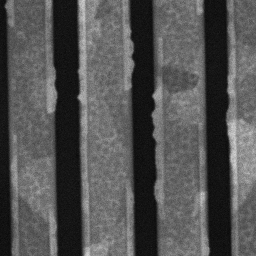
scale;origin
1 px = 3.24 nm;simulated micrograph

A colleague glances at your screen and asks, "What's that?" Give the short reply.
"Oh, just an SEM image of one or a few lines or trenches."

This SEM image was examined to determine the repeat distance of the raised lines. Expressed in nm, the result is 240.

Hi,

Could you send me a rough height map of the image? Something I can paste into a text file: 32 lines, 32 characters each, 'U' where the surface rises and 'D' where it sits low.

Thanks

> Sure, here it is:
DUUUUUDDDDUUUUUUDDDUUUUUUDDDUUUU
DUUUUUDDDDUUUUUUDDDUUUUUUDDDDUUU
DUUUUUDDDDUUUUUUDDDUUUUUUDDDDUUU
DUUUUUDDDDUUUUUUDDDDUUUUUDDDDUUU
DUUUUUDDDDUUUUUUDDDDUUUUUDDDDUUU
DUUUUUDDDDUUUUUUUDDDUUUUUDDDDUUU
DUUUUUDDDDUUUUUUUDDDUUUUUDDDDUUU
DUUUUUUDDDUUUUUUUDDDUUUUUDDDDUUU
DUUUUUUDDDUUUUUUUDDDUUUUUDDDDUUU
DUUUUUUDDDUUUUUUDDDDUUUUUDDDDUUU
DUUUUUUDDDUUUUUUDDDDUUUUUDDDDUUU
DUUUUUUDDDUUUUUUDDDUUUUUUDDDDUUU
DUUUUUUDDDUUUUUUDDDUUUUUUDDDDUUU
DUUUUUUDDDUUUUUUDDDUUUUUUDDDDUUU
DUUUUUUDDDUUUUUUDDDUUUUUUDDDUUUU
DUUUUUUDDDUUUUUUDDDUUUUUUDDDUUUU
DUUUUUUDDDUUUUUUDDDUUUUUUUDDDUUU
DUUUUUUDDDUUUUUUDDDUUUUUUUDDDUUU
DUUUUUUDDDUUUUUUDDDUUUUUUUDDDUUU
DUUUUUUDDDUUUUUUDDDUUUUUUUDDDUUU
DUUUUUUDDDUUUUUUDDDDUUUUUUDDDUUU
DUUUUUUDDDUUUUUUDDDDUUUUUUDDDUUU
DDUUUUUDDDUUUUUUDDDDUUUUUUDDDUUU
DDUUUUUDDDUUUUUUDDDUUUUUUUDDDUUU
DDUUUUUDDDUUUUUUUDDUUUUUUUDDDUUU
DDUUUUUDDDUUUUUUUDDDUUUUUUDDDUUU
DDUUUUUDDDDUUUUUUDDDUUUUUUDDDUUU
DDUUUUUDDDDUUUUUUDDDUUUUUUDDDUUU
DDUUUUUDDDDUUUUUUDDDUUUUUUDDDUUU
DDUUUUUDDDDUUUUUUDDDUUUUUUDDDUUU
DDUUUUUDDDDUUUUUUDDDUUUUUUDDDUUU
DUUUUUUDDDDUUUUUUDDDUUUUUUDDDUUU